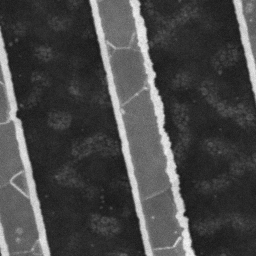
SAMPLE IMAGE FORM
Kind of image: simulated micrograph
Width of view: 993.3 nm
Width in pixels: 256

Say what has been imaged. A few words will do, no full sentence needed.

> one or a few lines or trenches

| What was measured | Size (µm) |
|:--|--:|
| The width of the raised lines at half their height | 0.161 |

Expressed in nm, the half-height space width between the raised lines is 384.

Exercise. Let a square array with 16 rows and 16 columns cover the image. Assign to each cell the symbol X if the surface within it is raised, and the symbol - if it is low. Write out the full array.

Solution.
------XXX------X
------XXX------X
------XXX------X
-------XX-------
-------XX-------
X------XXX------
X------XXX------
X------XXX------
X-------XX------
XX------XXX-----
XX------XXX-----
XX------XXX-----
XX-------XX-----
XX-------XX-----
XXX------XXX----
XXX------XXX----